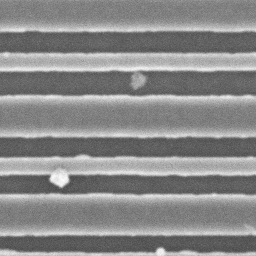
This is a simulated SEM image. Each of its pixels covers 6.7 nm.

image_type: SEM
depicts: lines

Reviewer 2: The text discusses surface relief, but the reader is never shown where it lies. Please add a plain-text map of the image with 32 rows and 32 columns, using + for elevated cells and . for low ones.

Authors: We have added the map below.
++++++++++++++++++++++++++++++++
++++++++++++++++++++++++++++++++
++++++++++++++++++++++++++++++++
++++++++++++++++++++++++++++++++
................................
................................
................................
++++++++++++++++++++++++++++++++
++++++++++++++++++++++++++++++++
................................
................................
................................
++++++++++++++++++++++++++++++++
++++++++++++++++++++++++++++++++
++++++++++++++++++++++++++++++++
++++++++++++++++++++++++++++++++
++++++++++++++++++++++++++++++++
................................
................................
................................
++++++++++++++++++++++++++++++++
++++++++++++++++++++++++++++++++
......++........................
................................
++++++++++++++++++++++++++++++++
++++++++++++++++++++++++++++++++
++++++++++++++++++++++++++++++++
++++++++++++++++++++++++++++++++
++++++++++++++++++++++++++++++++
................................
................................
...................++...........